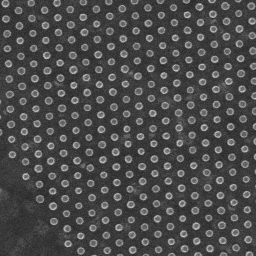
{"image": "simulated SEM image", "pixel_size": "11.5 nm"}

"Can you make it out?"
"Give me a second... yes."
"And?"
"a regular array of raised bodies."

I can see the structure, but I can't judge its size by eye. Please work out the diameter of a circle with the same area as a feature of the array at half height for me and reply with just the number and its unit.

75.6 nm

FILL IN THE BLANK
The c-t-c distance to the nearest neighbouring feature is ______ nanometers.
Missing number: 168